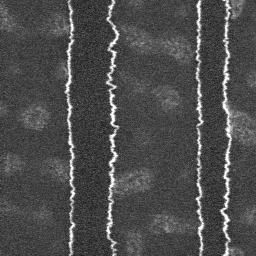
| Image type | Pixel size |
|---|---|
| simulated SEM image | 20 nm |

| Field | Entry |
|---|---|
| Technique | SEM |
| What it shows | one or a few lines or trenches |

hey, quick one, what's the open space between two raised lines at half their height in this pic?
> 1730 nanometers